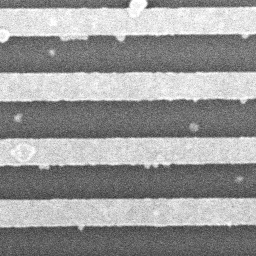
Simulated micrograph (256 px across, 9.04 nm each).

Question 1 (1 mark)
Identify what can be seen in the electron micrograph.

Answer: lines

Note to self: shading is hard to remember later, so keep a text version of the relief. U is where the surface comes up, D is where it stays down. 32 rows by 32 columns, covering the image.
DDDDDDDDDDDDDDDDUUDDDDDDDDDDDDDD
UUUUUUUUUUUUUUUUUUUUUUUUUUUUUUUU
UUUUUUUUUUUUUUUUUUUUUUUUUUUUUUUU
UUUUUUUUUUUUUUUUUUUUUUUUUUUUUUUU
UUDDDDDDDDDDDDDDDDDDDDDDDDDDDDDD
DDDDDDDDDDDDDDDDDDDDDDDDDDDDDDDD
DDDDDDDDDDDDDDDDDDDDDDDDDDDDDDDD
DDDDDDDDDDDDDDDDDDDDDDDDDDDDDDDD
DDDDDDDDDDDDDDDDDDDDDDDDDDDDDDDD
UUUUUUUUUUUUUUUUUUUUUUUUUUUUUUUU
UUUUUUUUUUUUUUUUUUUUUUUUUUUUUUUU
UUUUUUUUUUUUUUUUUUUUUUUUUUUUUUUU
UUUUDDUDDDDDDDDDDDDDDDDDDDDDDDDD
DDDDDDDDDDDDDDDDDDDDDDDDDDDDDDDD
DDDDDDDDDDDDDDDDDDDDDDDDDDDDDDDD
DDDDDDDDDDDDDDDDDDDDDDDDDDDDDDDD
DDDDDDDDDDDDDDDDDDDDDDDDDDDDDDDD
UUUUUUUUUUUUUUUUUUUUUUUUUUUUUUUU
UUUUUUUUUUUUUUUUUUUUUUUUUUUUUUUU
UUUUUUUUUUUUUUUUUUUUUUUUUUUUUUUU
UUUUUUUUUUUUDUUDUDDDDDDDDDDDDDDD
DDDDDDDDDDDDDDDDDDDDDDDDDDDDDDDD
DDDDDDDDDDDDDDDDDDDDDDDDDDDDDDDD
DDDDDDDDDDDDDDDDDDDDDDDDDDDDDDDD
DDDDDDDDDDDDDDDDDDDDDDDDDDDDDDDD
UUUUUUUUUUUUUUUUUUUUUUUUUUUUUUUU
UUUUUUUUUUUUUUUUUUUUUUUUUUUUUUUU
UUUUUUUUUUUUUUUUUUUUUUUUUUUUUUUU
DDDDDDDDDDDDDDDDDDDDDDDDDDDDDDDD
DDDDDDDDDDDDDDDDDDDDDDDDDDDDDDDD
DDDDDDDDDDDDDDDDDDDDDDDDDDDDDDDD
DDDDDDDDDDDDDDDDDDDDDDDDDDDDDDDD